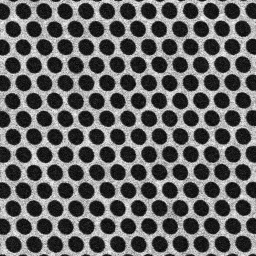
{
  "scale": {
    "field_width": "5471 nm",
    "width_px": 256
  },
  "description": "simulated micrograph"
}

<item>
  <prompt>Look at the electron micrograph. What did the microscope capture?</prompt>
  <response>a regular array of holes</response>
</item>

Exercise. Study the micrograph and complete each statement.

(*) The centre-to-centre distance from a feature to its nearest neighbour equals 436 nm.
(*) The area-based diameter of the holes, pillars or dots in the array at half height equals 350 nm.